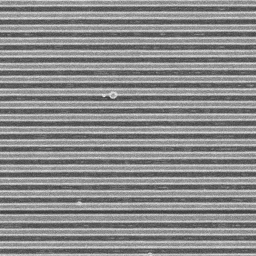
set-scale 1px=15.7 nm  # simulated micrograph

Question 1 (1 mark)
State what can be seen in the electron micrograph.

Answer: parallel lines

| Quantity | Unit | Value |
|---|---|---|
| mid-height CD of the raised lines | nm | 108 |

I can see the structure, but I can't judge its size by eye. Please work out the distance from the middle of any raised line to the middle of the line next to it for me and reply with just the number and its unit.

0.2 µm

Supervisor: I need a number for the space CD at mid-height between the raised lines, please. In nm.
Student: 96.2